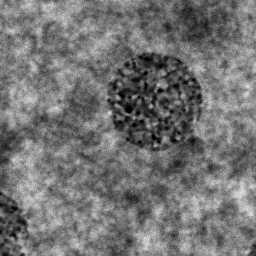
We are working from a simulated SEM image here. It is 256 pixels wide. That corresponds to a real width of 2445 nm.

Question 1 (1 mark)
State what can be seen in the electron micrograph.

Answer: raised bodies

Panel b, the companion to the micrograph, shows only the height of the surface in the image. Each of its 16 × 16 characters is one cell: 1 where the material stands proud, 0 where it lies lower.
0000000000000000
0000000000000000
0000000000000000
0000000001100000
0000000111110000
0000000111111000
0000000111111000
0000000111110000
0000000011110000
0000000000000000
0000000000000000
0000000000000000
1000000000000000
1100000000000000
1100000000000000
1100000000000000